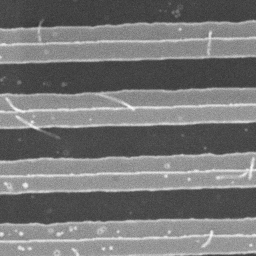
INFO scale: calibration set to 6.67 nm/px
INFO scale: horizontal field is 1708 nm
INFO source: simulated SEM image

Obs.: lines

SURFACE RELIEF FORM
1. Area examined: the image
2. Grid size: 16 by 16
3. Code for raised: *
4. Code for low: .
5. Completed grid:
................
........********
****************
****************
................
................
****************
****************
................
................
****************
****************
................
................
****************
****************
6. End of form